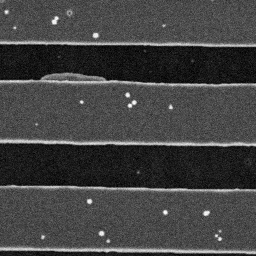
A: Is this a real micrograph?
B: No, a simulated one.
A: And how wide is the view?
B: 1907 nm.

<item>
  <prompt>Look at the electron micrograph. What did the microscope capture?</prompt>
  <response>lines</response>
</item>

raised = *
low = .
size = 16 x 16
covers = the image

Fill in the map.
****************
****************
****************
................
................
****************
****************
****************
****************
................
................
................
****************
****************
****************
****************